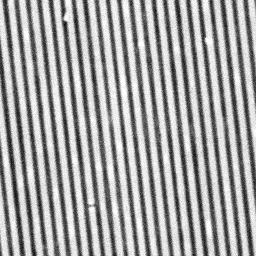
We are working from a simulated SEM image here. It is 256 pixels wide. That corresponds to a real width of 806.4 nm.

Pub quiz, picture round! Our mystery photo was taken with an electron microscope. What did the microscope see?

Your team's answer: parallel lines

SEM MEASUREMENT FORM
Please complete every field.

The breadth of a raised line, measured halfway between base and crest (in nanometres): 16.8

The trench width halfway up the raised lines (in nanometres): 19.6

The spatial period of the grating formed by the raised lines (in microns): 0.0359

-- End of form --